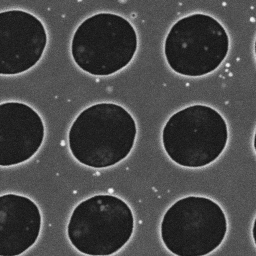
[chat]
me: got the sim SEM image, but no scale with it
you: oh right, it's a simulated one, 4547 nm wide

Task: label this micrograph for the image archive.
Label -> holes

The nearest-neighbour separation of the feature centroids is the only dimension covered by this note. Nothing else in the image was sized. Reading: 91 pixels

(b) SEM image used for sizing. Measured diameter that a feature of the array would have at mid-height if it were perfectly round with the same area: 63.4 px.